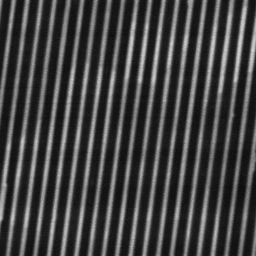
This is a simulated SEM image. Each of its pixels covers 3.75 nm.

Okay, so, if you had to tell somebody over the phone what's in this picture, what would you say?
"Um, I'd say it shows parallel lines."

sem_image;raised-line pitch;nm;50.8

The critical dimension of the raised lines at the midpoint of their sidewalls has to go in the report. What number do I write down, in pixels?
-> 5.71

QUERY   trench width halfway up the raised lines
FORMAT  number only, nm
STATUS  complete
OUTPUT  29.7